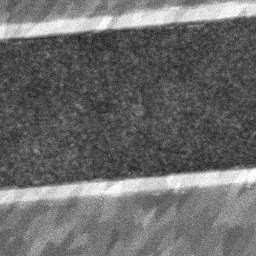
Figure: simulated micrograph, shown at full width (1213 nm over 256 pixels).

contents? one or a few lines or trenches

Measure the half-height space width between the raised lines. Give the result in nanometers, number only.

775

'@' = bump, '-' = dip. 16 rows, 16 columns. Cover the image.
@@@@@@@@@@@@@@@@
@@@@@@----------
----------------
----------------
----------------
----------------
----------------
----------------
----------------
----------------
----------------
---------@@@@@@@
@@@@@@@@@@@@@@@@
@@@@@@@@@@@@@@@@
@@@@@@@@@@@@@@@@
@@@@@@@@@@@@@@@@